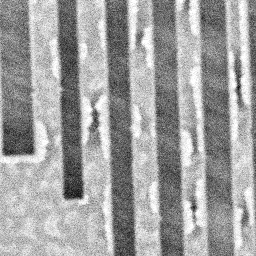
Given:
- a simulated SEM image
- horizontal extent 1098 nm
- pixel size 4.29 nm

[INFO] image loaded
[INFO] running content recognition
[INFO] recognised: parallel lines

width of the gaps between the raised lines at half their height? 107 nm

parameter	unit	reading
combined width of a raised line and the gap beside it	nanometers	208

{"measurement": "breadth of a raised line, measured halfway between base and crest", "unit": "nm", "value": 94.9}